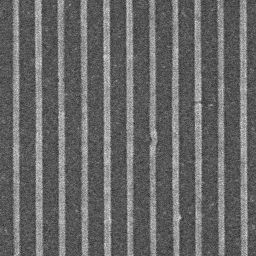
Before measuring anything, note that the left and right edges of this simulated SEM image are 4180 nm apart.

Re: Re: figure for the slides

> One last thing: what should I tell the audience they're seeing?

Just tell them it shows parallel lines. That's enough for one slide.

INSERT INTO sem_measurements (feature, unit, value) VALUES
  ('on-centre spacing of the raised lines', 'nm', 372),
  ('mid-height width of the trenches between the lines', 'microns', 0.292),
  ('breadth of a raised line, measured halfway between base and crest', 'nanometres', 83.7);